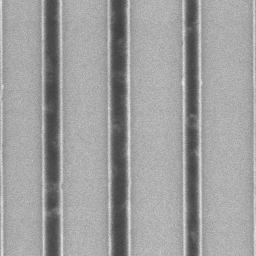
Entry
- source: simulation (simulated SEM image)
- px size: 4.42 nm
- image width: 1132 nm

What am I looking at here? one or a few lines or trenches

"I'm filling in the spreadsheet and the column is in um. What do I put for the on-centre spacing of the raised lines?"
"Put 0.309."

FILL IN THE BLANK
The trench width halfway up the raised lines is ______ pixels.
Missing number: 50.1